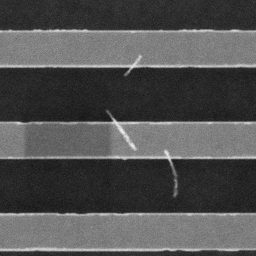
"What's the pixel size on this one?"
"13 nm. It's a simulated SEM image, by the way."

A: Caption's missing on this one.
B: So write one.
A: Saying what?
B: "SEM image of lines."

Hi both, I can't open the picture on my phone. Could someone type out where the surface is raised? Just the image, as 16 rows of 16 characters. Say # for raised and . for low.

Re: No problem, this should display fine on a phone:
................
................
################
################
................
................
................
................
################
################
................
................
................
################
################
################